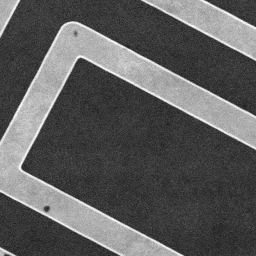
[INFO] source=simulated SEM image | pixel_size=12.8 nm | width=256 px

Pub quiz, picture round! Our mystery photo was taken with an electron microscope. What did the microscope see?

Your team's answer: groups of lines, slits or small figures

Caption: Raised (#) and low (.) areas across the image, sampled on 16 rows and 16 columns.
#.........####..
....#.......####
...####.......##
...######......#
..##...####.....
..##.....####...
.##........####.
.##..........###
##............##
##..............
#...............
###.............
.####...........
...####.........
.....####.......
.......###......